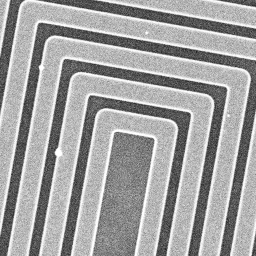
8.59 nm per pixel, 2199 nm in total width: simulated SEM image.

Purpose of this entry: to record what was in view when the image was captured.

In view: groups of lines, slits or small figures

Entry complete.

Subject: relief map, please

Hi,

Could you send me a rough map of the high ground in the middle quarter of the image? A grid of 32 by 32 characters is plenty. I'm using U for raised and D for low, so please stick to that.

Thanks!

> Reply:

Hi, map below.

DDDDDDDDDDDUUUUUUUUUUUUUUUUUUUUU
DDDDDDDDDDDDDDDDDUUUUUUUUUUUUUUU
DDDUUUDDDDDDDDDDDDDDDDDDUUUUUUUU
DDUUUUUUUUUUDDDDDDDDDDDDDDDDDUUU
DDUUUUUUUUUUUUUUUDDDDDDDDDDDDDDD
DDUUUUUUUUUUUUUUUUUUUUUDDDDDDDDD
DUUUUUUUUUUUUUUUUUUUUUUUUUUUUUDD
DUUUUUUUUUUUUUUUUUUUUUUUUUUUUUUU
DUUUUUDDDDDDUUUUUUUUUUUUUUUUUUUU
DUUUUUDDDDDDDDDDDUUUUUUUUUUUUUUU
DUUUUDDDDDDDDDDDDDDDDDDDUUUUUUUU
UUUUUDDDDUUUDDDDDDDDDDDDDDDDDUUU
UUUUUDDDUUUUUUUUUUDDDDDDDDDDDDDD
UUUUUDDDUUUUUUUUUUUUUUUDDDDDDDDD
UUUUUDDDUUUUUUUUUUUUUUUUUUUUDDDD
UUUUUDDDUUUUUUUUUUUUUUUUUUUUDDDD
UUUUUDDUUUUUUUUUUUUUUUUUUUUUDDDU
UUUUDDDUUUUUDDDDDUUUUUUUUUUUDDDU
UUUUDDDUUUUUDDDDDDDDDDUUUUUUDDDU
UUUUDDDUUUUUDDDDDDDDDDDUUUUUDDDU
UUUUDDDUUUUUDDDDDDDDDDDUUUUUDDDU
UUUUDDDUUUUUDDDDDDDDDDUUUUUUDDUU
UUUDDDUUUUUDDDDDDDDDDDUUUUUDDDUU
UUUDDDUUUUUDDDDDDDDDDDUUUUUDDDUU
UUUDDDUUUUUDDDDDDDDDDDUUUUUDDDUU
UUUDDDUUUUUDDDDDDDDDDDUUUUUDDDUU
UUUDDDUUUUUDDDDDDDDDDDUUUUUDDDUU
UUUDDUUUUUUDDDDDDDDDDUUUUUDDDUUU
UUDDDUUUUUDDDDDDDDDDDUUUUUDDDUUU
UUDDDUUUUUDDDDDDDDDDDUUUUUDDDUUU
UUDDDUUUUUDDDDDDDDDDDUUUUUDDDUUU
UUDDDUUUUUDDDDDDDDDDDUUUUUDDDUUU